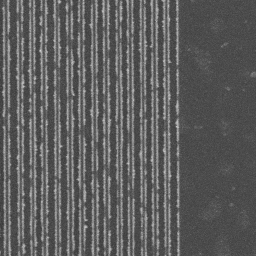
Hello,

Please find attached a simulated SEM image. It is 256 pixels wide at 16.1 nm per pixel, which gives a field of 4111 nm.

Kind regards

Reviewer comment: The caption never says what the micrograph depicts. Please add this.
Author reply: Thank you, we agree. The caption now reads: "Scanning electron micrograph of parallel lines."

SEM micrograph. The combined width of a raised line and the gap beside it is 198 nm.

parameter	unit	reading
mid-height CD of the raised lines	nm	94.4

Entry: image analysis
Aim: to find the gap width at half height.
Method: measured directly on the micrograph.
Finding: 0.102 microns